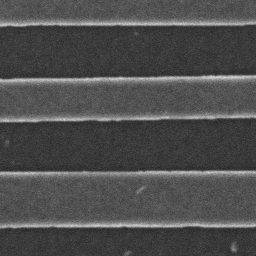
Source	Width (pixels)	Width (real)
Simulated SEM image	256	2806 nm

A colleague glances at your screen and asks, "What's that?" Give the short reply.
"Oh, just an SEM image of lines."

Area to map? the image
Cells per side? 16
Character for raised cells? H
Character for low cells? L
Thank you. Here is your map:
HHHHHHHHHHHHHHHH
HHHHHHHHHHHHHHHH
LLLLLLLLLLLLLLLL
LLLLLLLLLLLLLLLL
LLLLLLLLLLLLLLLL
HHHHHHHHHHHHHHHH
HHHHHHHHHHHHHHHH
HHHHHHHHLLLLLLLL
LLLLLLLLLLLLLLLL
LLLLLLLLLLLLLLLL
LLLLLLLLLLLLLLLL
HHHHHHHHHHHHHHHH
HHHHHHHHHHHHHHHH
HHHHHHHHHHHHHHHH
LLLLLLLLLLLLLLLL
LLLLLLLLLLLLLLLL